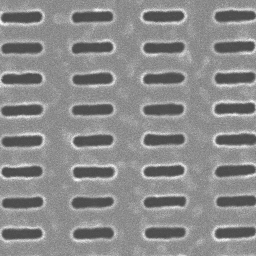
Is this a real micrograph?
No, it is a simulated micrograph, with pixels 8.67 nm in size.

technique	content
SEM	a regular array of holes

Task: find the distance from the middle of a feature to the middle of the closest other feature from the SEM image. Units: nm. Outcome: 266